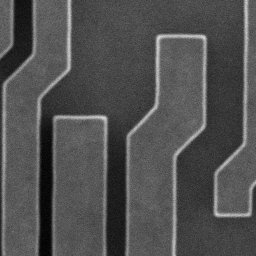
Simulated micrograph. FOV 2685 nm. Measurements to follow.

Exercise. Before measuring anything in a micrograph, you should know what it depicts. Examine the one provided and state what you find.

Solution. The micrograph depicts groups of lines, slits or small figures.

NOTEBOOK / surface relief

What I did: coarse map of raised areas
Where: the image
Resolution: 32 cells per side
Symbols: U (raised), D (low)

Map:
UUDDUUUUUDDDDDDDDDDDDDDDDDDDDDDU
UUDDUUUUUDDDDDDDDDDDDDDDDDDDDDDU
UUDDUUUUUDDDDDDDDDDDDDDDDDDDDDDU
UUDDUUUUUDDDDDDDDDDDDDDDDDDDDDDU
UUDDUUUUUDDDDDDDDDDDDDDDDDDDDDDU
UUDDUUUUUDDDDDDDDDDDUUUUUUDDDDDU
UDDDUUUUUDDDDDDDDDDDUUUUUUDDDDDU
DDDUUUUUUDDDDDDDDDDDUUUUUUDDDDDU
DDUUUUUUUDDDDDDDDDDDUUUUUUDDDDDU
DUUUUUUUDDDDDDDDDDDDUUUUUUDDDDDU
DUUUUUUDDDDDDDDDDDDDUUUUUUDDDDDU
UUUUUUDDDDDDDDDDDDDDUUUUUUDDDDDU
UUUUUDDDDDDDDDDDDDDDUUUUUUDDDDDU
UUUUUDDDDDDDDDDDDDDUUUUUUUDDDDDU
UUUUUDDDDDDDDDDDDDUUUUUUUUDDDDDU
UUUUUDDUUUUUUDDDDUUUUUUUUUDDDDDU
UUUUUDDUUUUUUDDDUUUUUUUUUDDDDDDU
UUUUUDDUUUUUUDDDUUUUUUUUDDDDDDDU
UUUUUDDUUUUUUDDDUUUUUUUDDDDDDDUU
UUUUUDDUUUUUUDDDUUUUUUDDDDDDDUUU
UUUUUDDUUUUUUDDDUUUUUUDDDDDDUUUU
UUUUUDDUUUUUUDDDUUUUUUDDDDDUUUUU
UUUUUDDUUUUUUDDDUUUUUUDDDDDUUUUU
UUUUUDDUUUUUUDDDUUUUUUDDDDDUUUUU
UUUUUDDUUUUUUDDDUUUUUUDDDDDUUUUD
UUUUUDDUUUUUUDDDUUUUUUDDDDDUUUUD
UUUUUDDUUUUUUDDDUUUUUUDDDDDUUUUD
UUUUUDDUUUUUUDDDUUUUUUDDDDDDDDDD
UUUUUDDUUUUUUDDDUUUUUUDDDDDDDDDD
UUUUUDDUUUUUUDDDUUUUUUDDDDDDDDDD
UUUUUDDUUUUUUDDDUUUUUUDDDDDDDDDD
UUUUUDDUUUUUUDDDUUUUUUDDDDDDDDDD